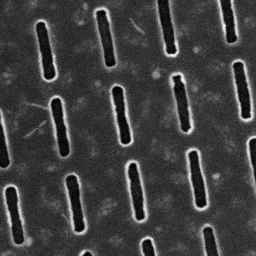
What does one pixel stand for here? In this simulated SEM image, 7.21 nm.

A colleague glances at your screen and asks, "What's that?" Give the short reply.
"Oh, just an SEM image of a regular array of holes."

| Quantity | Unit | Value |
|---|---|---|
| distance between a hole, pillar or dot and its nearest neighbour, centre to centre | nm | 445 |